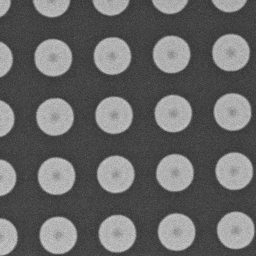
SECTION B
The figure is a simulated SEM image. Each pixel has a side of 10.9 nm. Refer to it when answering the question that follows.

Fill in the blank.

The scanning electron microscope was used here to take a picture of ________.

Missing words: an array of small figures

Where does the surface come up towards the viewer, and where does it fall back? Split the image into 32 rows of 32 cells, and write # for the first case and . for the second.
#...#####...####...####....####.
#....###.....##.....##..........
................................
................................
............................##..
.....###....####....###....####.
#...#####...####...#####...####.
##..#####...####...#####...####.
#....####...####....###.....##..
................................
................................
................................
......##.....###....###....####.
#....####...####...#####...####.
##...####...#####..#####...####.
##...####...####....####...####.
#.....##.....##.................
................................
................................
.....................##.....###.
#....####....###....####...####.
##...####...#####...####...#####
##...####...#####...####...####.
##...####....###.....##.....##..
................................
................................
................................
#.....##.....###....####....###.
##...####...#####...####...#####
##...#####..#####...####...#####
##...####....####...####....###.
#.....##........................